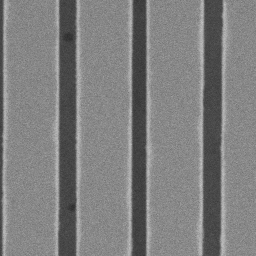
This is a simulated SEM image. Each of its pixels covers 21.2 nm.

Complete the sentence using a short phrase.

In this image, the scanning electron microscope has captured lines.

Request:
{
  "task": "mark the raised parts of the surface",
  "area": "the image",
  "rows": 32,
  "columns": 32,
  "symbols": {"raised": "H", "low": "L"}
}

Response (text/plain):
HHHHHHHLLLHHHHHHHLHHHHHHHLLLHHHH
HHHHHHHLLLHHHHHHHLHHHHHHHLLLHHHH
HHHHHHHLLLHHHHHHHLHHHHHHHLLLHHHH
HHHHHHHLLLHHHHHHLLHHHHHHHLLLHHHH
HHHHHHHLLLHHHHHHHLHHHHHHHLLLHHHH
HHHHHHHLLLHHHHHHLLHHHHHHHLLLHHHH
HHHHHHHLLLHHHHHHLLHHHHHHHLLLHHHH
HHHHHHHLLLHHHHHHLLHHHHHHHLLLHHHH
HHHHHHHLLLHHHHHHLLHHHHHHHLLLHHHH
HHHHHHHLLLHHHHHHLLHHHHHHHLLLHHHH
HHHHHHHLLLHHHHHHLLHHHHHHHLLLHHHH
HHHHHHHLLLHHHHHHLLHHHHHHHLLLHHHH
HHHHHHHLLLHHHHHHLLHHHHHHHLLLHHHH
HHHHHHHLLLHHHHHHLLHHHHHHHLLLHHHH
HHHHHHHLLLHHHHHHLLHHHHHHHLLLHHHH
HHHHHHHLLLHHHHHHLLHHHHHHHLLLHHHH
HHHHHHHLLLHHHHHHLLHHHHHHHLLLHHHH
HHHHHHHLLLHHHHHHLLHHHHHHHLLLHHHH
HHHHHHHLLLHHHHHHLLHHHHHHHLLLHHHH
HHHHHHHLLLHHHHHHLLHHHHHHHLLLHHHH
HHHHHHHLLLHHHHHHLLHHHHHHHLLLHHHH
HHHHHHHLLLHHHHHHLLHHHHHHHLLLHHHH
HHHHHHHLLLHHHHHHLLHHHHHHHLLLHHHH
HHHHHHHLLLHHHHHHLLHHHHHHHLLLHHHH
HHHHHHHLLLHHHHHHLLHHHHHHHLLLHHHH
HHHHHHHLLLHHHHHHLLHHHHHHHLLLHHHH
HHHHHHHLLLHHHHHHLLHHHHHHHLLLHHHH
HHHHHHHLLLHHHHHHLLHHHHHHHLLLHHHH
HHHHHHHLLLHHHHHHLLHHHHHHHLLLHHHH
HHHHHHHLLLHHHHHHLLHHHHHHHLLLHHHH
HHHHHHHLLLHHHHHHLLHHHHHHHLLLHHHH
HHHHHHHLLLHHHHHHLLHHHHHHHLLLHHHH